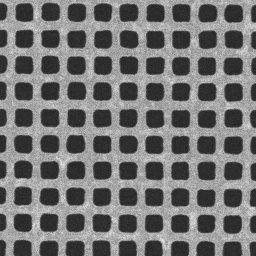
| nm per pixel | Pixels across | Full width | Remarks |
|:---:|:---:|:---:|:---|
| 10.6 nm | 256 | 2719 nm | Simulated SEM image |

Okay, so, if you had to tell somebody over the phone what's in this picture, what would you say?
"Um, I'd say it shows a regular array of holes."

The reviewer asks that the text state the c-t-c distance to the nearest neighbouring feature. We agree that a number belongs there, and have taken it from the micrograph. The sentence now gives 276 nanometers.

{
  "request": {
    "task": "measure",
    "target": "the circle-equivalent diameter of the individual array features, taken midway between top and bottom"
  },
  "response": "19.8 pixels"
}